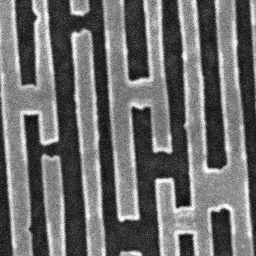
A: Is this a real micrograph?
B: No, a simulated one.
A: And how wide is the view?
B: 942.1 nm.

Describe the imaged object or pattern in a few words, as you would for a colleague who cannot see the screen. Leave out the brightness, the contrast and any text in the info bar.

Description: parallel lines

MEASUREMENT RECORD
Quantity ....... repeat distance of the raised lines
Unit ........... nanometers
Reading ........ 135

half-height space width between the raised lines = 18.5 pixels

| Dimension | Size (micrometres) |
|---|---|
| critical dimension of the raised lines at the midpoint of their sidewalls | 0.0679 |